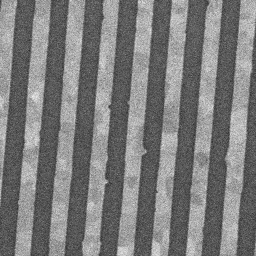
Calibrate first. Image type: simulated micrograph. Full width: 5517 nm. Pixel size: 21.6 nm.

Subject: parallel lines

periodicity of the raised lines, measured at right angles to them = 736 nanometers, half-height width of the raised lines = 333 nm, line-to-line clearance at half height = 0.416 um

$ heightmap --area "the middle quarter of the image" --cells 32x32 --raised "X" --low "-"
XXXX-----XXX-----XXXX-----XXX---
XXXX-----XXX-----XXXX-----XXXX--
XXXX-----XXX-----XXXX-----XXX---
XXXX----XXXX-----XXXX-----XXX---
XXXX----XXXX-----XXXX-----XXX---
XXX-----XXXX-----XXXX-----XXX---
XXX-----XXXX-----XXX-----XXXX---
XXX-----XXXX-----XXX-----XXXX---
XXX-----XXXX-----XXX-----XXXX---
XXX-----XXXX----XXXX-----XXXX---
XXX-----XXX-----XXXX-----XXXX---
XXX-----XXX------XXX-----XXXX---
XXX-----XXX-----XXXX-----XXXX---
XXX-----XXX-----XXXX-----XXXX---
XXX-----XXX-----XXXX-----XXXX---
XXX-----XXX-----XXXX-----XXX----
XXX-----XXX-----XXXX-----XXX----
XX------XXX-----XXXX-----XXX----
XX-----XXXX-----XXXX-----XXX----
XX-----XXXX-----XXX-----XXXX----
XX-----XXXX-----XXX-----XXXX----
XX-----XXXX-----XXXX----XXXX----
XX-----XXXX-----XXXX----XXXX----
XX-----XXXX-----XXX-----XXXX----
XX-----XXXX----XXXX-----XXXX----
XX-----XXX-----XXXX-----XXXX----
XX-----XXX-----XXXX-----XXXX----
XX-----XXX-----XXXX-----XXX-----
XX-----XXX-----XXXX-----XXX-----
XX-----XXXX----XXXX-----XXX-----
X-----XXXX-----XXX-----XXXX-----
X-----XXXX-----XXX-----XXXX-----